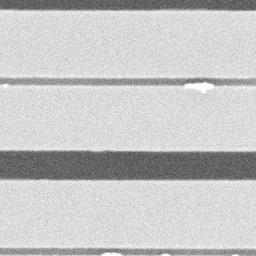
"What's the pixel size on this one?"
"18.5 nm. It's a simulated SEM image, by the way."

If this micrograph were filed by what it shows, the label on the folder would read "lines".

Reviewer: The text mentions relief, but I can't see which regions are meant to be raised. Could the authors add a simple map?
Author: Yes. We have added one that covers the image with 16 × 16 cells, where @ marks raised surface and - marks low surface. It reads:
----------------
@@@@@@@@@@@@@@@@
@@@@@@@@@@@@@@@@
@@@@@@@@@@@@@@@@
@@@@@@@@@@@@@@@@
@@@@@@@@@@@@@@@@
@@@@@@@@@@@@@@@@
@@@@@@@@@@@@@@@@
@@@@@@@@@@@@@@@@
----------------
----------------
@@@@@@@@@@@@@@@@
@@@@@@@@@@@@@@@@
@@@@@@@@@@@@@@@@
@@@@@@@@@@@@@@@@
@@@@@@@@@@@@@@@@